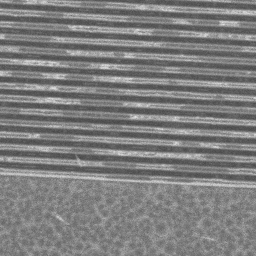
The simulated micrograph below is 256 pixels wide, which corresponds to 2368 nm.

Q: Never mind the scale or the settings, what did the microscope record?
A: parallel lines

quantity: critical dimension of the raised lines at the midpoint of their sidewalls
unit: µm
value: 0.0531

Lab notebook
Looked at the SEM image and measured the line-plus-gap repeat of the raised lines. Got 113 nm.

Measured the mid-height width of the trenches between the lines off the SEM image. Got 0.0612 microns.